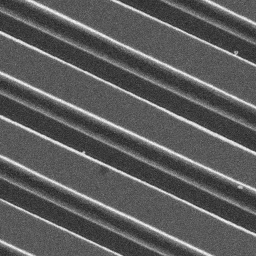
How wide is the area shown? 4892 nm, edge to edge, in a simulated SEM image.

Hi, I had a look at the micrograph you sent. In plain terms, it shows lines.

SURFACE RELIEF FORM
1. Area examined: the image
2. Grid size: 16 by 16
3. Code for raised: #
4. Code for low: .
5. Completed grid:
...#####......##
.....#####......
#......######...
###......######.
#####......#####
..#####......###
....######.....#
#.....######....
###.....######..
#####......#####
.######......###
....#####......#
......#####.....
##......######..
####......######
.######.....####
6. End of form